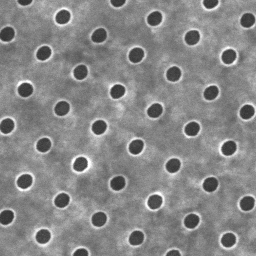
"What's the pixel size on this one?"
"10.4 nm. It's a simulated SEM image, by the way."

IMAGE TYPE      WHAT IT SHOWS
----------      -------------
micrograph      a regular array of holes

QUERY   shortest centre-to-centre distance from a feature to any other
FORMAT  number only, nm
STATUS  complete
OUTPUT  424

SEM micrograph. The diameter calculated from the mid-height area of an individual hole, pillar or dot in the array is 15.7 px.